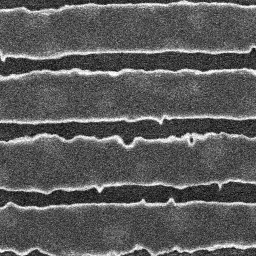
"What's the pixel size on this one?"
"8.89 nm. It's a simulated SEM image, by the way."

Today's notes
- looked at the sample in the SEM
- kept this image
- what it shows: one or a few lines or trenches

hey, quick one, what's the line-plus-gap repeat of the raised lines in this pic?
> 66.1 pixels